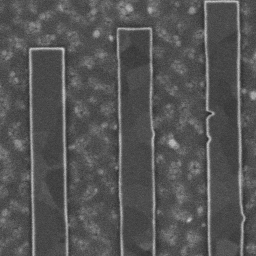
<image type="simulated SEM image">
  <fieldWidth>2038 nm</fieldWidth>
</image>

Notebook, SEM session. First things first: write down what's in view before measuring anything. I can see one or a few lines or trenches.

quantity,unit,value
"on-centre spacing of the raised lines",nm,699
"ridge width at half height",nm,264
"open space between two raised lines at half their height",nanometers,433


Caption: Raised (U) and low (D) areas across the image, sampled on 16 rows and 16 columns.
DDDDDDDDDDDDDUUD
DDDDDDDDDDDDDUUD
DDDDDDDUUDDDDUUD
DDUUDDDUUDDDDUUD
DDUUDDDUUDDDDUUD
DDUUDDDUUDDDDUUD
DDUUDDDUUDDDDUUD
DDUUDDDUUDDDDUUD
DDUUDDDUUUDDDUUD
DDUUDDDUUUDDDUUD
DDUUDDDDUUDDDUUD
DDUUDDDUUUDDDUUD
DDUUDDDUUUDDDUUD
DDUUDDDDUUDDDUUD
DDUUDDDDUUDDDUUD
DDUUDDDDUUDDDUUD